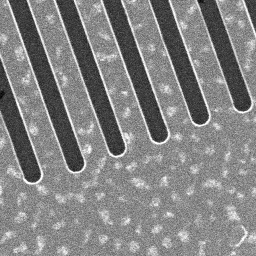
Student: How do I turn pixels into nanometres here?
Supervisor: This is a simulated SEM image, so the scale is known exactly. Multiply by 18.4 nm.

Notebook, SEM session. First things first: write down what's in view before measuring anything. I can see parallel lines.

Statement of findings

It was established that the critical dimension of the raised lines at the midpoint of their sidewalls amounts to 0.468 µm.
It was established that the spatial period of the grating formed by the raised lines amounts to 817 nanometers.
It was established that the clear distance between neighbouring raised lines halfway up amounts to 347 nanometers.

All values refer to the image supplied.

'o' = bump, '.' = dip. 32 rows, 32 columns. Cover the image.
o...ooo..oooo..oooo..oooo..oooo.
o...ooo...ooo...ooo...ooo...ooo.
oo..oooo..oooo..oooo..ooo...ooo.
oo...ooo...ooo..oooo..oooo..oooo
ooo..ooo...ooo...ooo...ooo...ooo
ooo..oooo..oooo..ooo...ooo...ooo
ooo...ooo...ooo..oooo..oooo..ooo
oooo..ooo...ooo...ooo...ooo...oo
.ooo..oooo..oooo..oooo..oooo..oo
.ooo...ooo...ooo...ooo...ooo..oo
.oooo..oooo..ooo...ooo...ooo...o
..ooo...ooo..oooo..oooo..oooo..o
..ooo...ooo...ooo...ooo...ooo..o
..oooo..oooo..ooo...ooo...ooo..o
...ooo...ooo..oooo..oooo..oooooo
o..ooo...ooo...ooo...ooo..oooooo
o..oooo..oooo..oooo..ooooooooooo
o...ooo...ooo...ooo..ooooooooooo
oo..oooo..ooo...oooooooooooooooo
oo..oooo..oooo.ooooooooooooooooo
oo...ooo...ooooooooooooooooooooo
ooo..oooo.oooooooooooooooooooooo
ooo..ooooooooooooooooooooooooooo
oooooooooooooooooooooooooooooooo
oooooooooooooooooooooooooooooooo
oooooooooooooooooooooooooooooooo
oooooooooooooooooooooooooooooooo
oooooooooooooooooooooooooooooooo
oooooooooooooooooooooooooooooooo
oooooooooooooooooooooooooooooooo
oooooooooooooooooooooooooooooooo
oooooooooooooooooooooooooooooooo